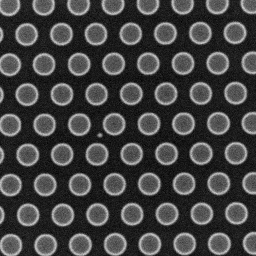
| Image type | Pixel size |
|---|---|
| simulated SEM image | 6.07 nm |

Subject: an array of small figures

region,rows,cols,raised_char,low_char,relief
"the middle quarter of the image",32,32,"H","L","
LHHHHHLLLLHHHHHLLLLHHHHHLLLHHHHH
LLHHHHLLLLHHHHHLLLLHHHHLLLLLHHHH
LLHHHLLLLLLLLLLLLLLLLLLLLLLLLHLL
LLLLLLLLLLLLLLLLLLLLLLLLLLLLLLLL
LLLLLLLLLLLLLLLLLLLLLLLLLLLLLLLL
HLLLLLHHHHLLLLLHHHHLLLLLHHHLLLLL
HHLLLLHHHHHLLLHHHHHLLLLHHHHHLLLL
HHLLLLHHHHHLLLHHHHHHLLLHHHHHLLLL
HHLLLLHHHHHLLLHHHHHLLLLHHHHHLLLL
HLLLLLHHHHLLLLLHHHLLLLLLHHHLLLLL
LLLLLLLLLLLLLLLLLLLLLLLLLLLLLLLL
LLLLLLLLLLLLLLLLLLLLLLLLLLLLLLLL
LLLLLLLLLLLLLLLLLLLLHHLLLLLLLHHL
LLHHHHLLLLHHHHHLLLLHHHHHLLLLHHHH
LHHHHHHLLLHHHHHLLLLHHHHHLLLHHHHH
LHHHHHHLLLHHHHHLLLLHHHHHLLLHHHHH
LLHHHHLLLLHHHHHLLLLHHHHLLLLLHHHH
LLHHHLLLLLLLHHLLLLLLHHLLLLLLLHHL
LLLLLLLLLLLLLLLLLLLLLLLLLLLLLLLL
LLLLLLLLLLLLLLLLLLLLLLLLLLLLLLLL
HLLLLLLHHHLLLLLHHHHLLLLLHHHLLLLL
HHLLLLHHHHHLLLLHHHHLLLLHHHHHLLLL
HHLLLLHHHHHLLLHHHHHLLLLHHHHHLLLL
HHLLLLHHHHHLLLLHHHHLLLLHHHHHLLLL
HLLLLLHHHHLLLLLHHHHLLLLLHHHLLLLL
LLLLLLLLLLLLLLLLLLLLLLLLLLLLLLLL
LLLLLLLLLLLLLLLLLLLLLLLLLLLLLLLL
LLLLLLLLLLLLHHLLLLLLHHLLLLLLLHHL
LLHHHHLLLLHHHHHLLLLHHHHLLLLLHHHH
LLHHHHHLLLHHHHHLLLLHHHHHLLLHHHHH
LLHHHHHLLLHHHHHLLLLHHHHHLLLHHHHH
LLHHHHLLLLHHHHHLLLLHHHHHLLLLHHHH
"